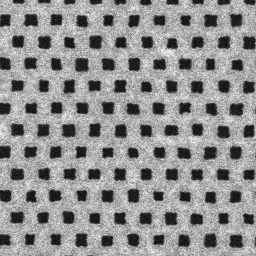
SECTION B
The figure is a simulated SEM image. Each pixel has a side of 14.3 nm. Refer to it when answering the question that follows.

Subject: a regular array of holes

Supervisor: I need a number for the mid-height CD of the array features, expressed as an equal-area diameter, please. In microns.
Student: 0.184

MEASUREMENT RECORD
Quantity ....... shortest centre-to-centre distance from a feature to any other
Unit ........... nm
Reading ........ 356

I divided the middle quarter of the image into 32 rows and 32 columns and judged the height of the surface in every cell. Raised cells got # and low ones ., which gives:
###...###....###...###....###...
###...####...###...#####.#######
################################
################################
...###...####..####...###...####
...###...####..####...###...####
...###...####..####...####...###
################################
################################
##########..####################
###...###....###...###...####...
###...###....###...###...####...
####..####..####...####..#######
################################
################################
...###...####..####..####...####
...###...####...###...###...####
...###...####...###...###...####
################################
################################
################################
###...####...###..####...###...#
###...####...###...###...###....
###.############..#####..###....
################################
################################
...###...####..####...####..####
...###...###...####...###...####
...###...###...####...####..####
################################
################################
##########..####...#############